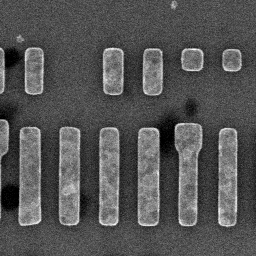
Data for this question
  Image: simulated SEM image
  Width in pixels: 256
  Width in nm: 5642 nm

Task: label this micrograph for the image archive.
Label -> wiring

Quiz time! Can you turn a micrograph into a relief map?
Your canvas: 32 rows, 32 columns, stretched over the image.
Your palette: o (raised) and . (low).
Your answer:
................................
................................
................................
................................
................................
................................
...oo........oo...oo...oo...oo..
...oo........oo...oo...oo...oo..
...oo........oo...oo...oo...oo..
...oo........oo...oo............
...oo........oo...oo............
....o........oo...oo............
................................
................................
................................
o.....................ooo.......
o..oo...oo...oo..ooo..ooo...o...
o..oo...oo...oo..ooo..ooo..ooo..
o..oo...oo...oo..ooo..ooo..ooo..
...oo...oo...oo..ooo..ooo..oo...
...oo..ooo...oo..ooo...oo..oo...
...oo..ooo...oo..ooo...oo..oo...
...oo..ooo...oo..ooo...oo..oo...
...oo..ooo...oo..ooo...oo..oo...
...oo..ooo...oo..ooo..ooo..oo...
..ooo..ooo...oo..ooo..ooo..oo...
..ooo..ooo...oo..ooo..ooo..oo...
..ooo..ooo...oo..ooo..ooo..oo...
................................
................................
................................
................................